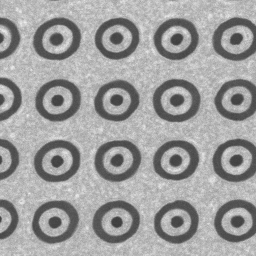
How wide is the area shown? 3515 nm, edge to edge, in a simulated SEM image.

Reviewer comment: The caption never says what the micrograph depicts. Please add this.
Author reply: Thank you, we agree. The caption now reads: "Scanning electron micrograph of a regular array of ring-shaped grooves with a dot in the middle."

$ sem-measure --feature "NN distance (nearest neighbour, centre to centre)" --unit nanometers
812